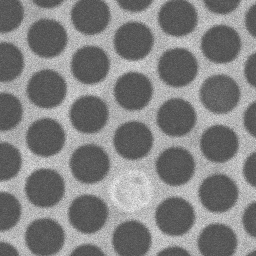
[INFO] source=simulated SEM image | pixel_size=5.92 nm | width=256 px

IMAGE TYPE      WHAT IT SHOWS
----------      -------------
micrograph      a regular array of holes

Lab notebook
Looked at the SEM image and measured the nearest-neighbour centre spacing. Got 0.292 µm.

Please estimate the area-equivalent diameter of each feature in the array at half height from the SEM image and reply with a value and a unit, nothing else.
238 nm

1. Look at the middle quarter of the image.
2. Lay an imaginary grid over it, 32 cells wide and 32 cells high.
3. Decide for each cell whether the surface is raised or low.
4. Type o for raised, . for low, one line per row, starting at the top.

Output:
oo.........oooooooooooo.........
oo.........oooooooooooo.........
oo.........oooo.....oooo........
ooo.......oooo.......ooo........
.ooo.....oooo.........ooo.......
.ooooooooooo..........oooo....oo
.ooooooooooo..........oooooooooo
.ooooooooooo..........oooooooooo
oooo.....oooo.........ooooo..ooo
oo........ooo........oooo......o
oo.........ooo.......ooo........
o..........ooooo...oooo.........
o..........oooooooooooo.........
o..........oooooooooooo.........
oo.........oooo....oooo.........
oo........oooo.......ooo........
ooo......oooo.........oo........
oooooo.oooooo.........ooo......o
.ooooooooooo..........oooooooooo
oooooooooooo..........oooooooooo
oooo.....ooo..........oooooooooo
ooo.......ooo.........ooo......o
oo.........ooo.......ooo........
oo.........oooo.....ooo.........
o..........oooooooooooo.........
o...........ooooooooooo.........
oo.........oooooooooooo.........
oo.........oooooooooooo.........
ooo.......oooooooooooooo........
oooo.....oooooooooooooooo......o
ooooooooooooooooooooooooooo..ooo
oooooooooooooooooooooooooooooooo